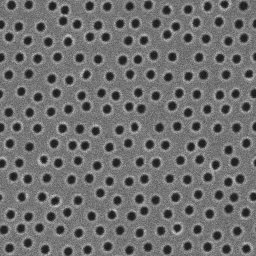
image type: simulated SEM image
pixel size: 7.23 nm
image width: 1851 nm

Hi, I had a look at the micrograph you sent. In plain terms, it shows a regular array of holes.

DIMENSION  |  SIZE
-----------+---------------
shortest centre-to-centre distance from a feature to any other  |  118 nm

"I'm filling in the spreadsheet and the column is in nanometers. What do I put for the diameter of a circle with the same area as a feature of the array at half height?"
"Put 62.1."